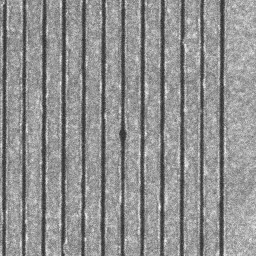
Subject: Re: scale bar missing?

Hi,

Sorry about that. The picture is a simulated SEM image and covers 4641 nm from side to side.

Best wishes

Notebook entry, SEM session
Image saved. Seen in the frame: parallel lines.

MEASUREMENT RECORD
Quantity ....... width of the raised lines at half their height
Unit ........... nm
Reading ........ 116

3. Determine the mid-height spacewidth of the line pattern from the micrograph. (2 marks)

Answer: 245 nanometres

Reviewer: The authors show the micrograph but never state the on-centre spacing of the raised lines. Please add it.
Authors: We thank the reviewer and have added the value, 358 nm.